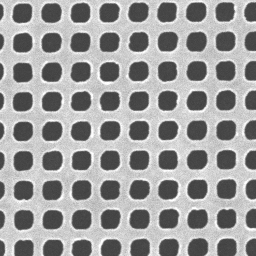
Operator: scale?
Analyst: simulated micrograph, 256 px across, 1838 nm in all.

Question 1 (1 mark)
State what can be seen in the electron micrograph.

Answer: a regular array of holes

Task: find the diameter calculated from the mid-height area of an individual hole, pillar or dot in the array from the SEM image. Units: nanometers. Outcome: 152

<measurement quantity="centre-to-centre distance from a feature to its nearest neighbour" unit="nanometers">206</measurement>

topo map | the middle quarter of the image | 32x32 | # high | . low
##.....##.....###....###....###.
##.....##.....##.....##.....###.
##.....##.....##.....##.....##..
##....###....###.....###....###.
###..#####..####################
################################
################################
##....####....###....###....###.
##.....##.....##.....##......##.
##.....##.....##.....##.....###.
##.....##.....##.....###....###.
##....####...####...####...####.
################################
################################
###...####....###....####...####
##.....##.....###....###.....##.
##.....##.....##.....##......##.
##.....##.....##.....##.....###.
##....###....####....###....###.
################################
################################
##################..#####..#####
##.....###....###....###....###.
##.....##.....##.....##.....###.
##.....##.....##.....##......##.
##....###.....###....###....###.
####.#####..######..#####..#####
################################
################################
###....###....###....###....####
##.....##.....###.....##.....##.
##.....##.....##......##.....##.